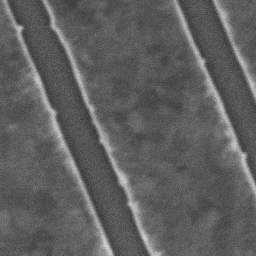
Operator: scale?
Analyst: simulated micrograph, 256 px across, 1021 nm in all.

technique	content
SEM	one or a few lines or trenches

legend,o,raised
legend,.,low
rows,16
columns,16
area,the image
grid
...oooooooo...oo
o..ooooooooo..oo
o...oooooooo..oo
oo..oooooooo...o
oo...oooooooo..o
ooo..oooooooo...
ooo...oooooooo..
ooo...oooooooo..
oooo..ooooooooo.
oooo...oooooooo.
ooooo..oooooooo.
ooooo...oooooooo
oooooo..oooooooo
oooooo..oooooooo
oooooo...ooooooo
ooooooo..ooooooo